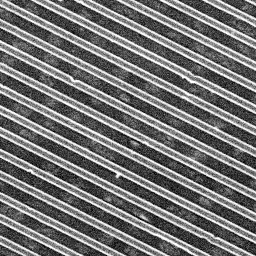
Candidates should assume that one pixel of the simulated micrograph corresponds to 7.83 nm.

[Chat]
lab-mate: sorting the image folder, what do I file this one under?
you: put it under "parallel lines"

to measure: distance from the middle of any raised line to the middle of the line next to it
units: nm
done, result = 151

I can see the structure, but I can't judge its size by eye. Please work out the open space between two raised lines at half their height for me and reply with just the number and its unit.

0.0944 µm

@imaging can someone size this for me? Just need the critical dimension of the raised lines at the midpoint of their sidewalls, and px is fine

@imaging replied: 6.92